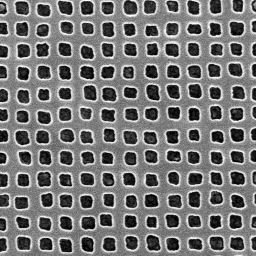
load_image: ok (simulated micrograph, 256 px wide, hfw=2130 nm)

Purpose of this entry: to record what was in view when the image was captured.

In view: a regular array of holes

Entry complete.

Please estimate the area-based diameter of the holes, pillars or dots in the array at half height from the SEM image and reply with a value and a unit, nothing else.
113 nm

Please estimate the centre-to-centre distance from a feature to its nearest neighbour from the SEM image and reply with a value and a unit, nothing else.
167 nanometres